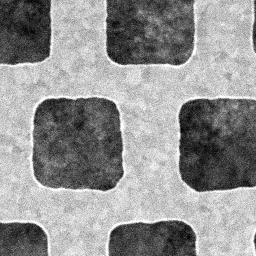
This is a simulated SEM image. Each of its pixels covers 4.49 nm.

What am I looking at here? holes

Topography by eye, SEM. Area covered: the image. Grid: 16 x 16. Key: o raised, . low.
...oooo.....oooo
...oooo.....oooo
...oooo.....oooo
...oooo.....oooo
oooooooooooooooo
oooooooooooooooo
oo.....ooooo....
oo......ooo.....
oo......ooo.....
oo......ooo.....
oo......ooo.....
ooo....ooooo....
oooooooooooooooo
oooooooooooooooo
...oooo.....oooo
...oooo.....oooo